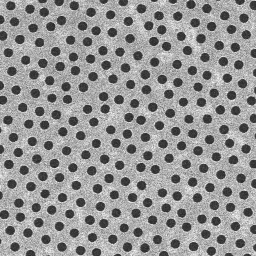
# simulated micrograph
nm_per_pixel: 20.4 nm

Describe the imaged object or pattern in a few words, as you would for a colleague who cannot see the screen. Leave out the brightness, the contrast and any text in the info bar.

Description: a regular array of holes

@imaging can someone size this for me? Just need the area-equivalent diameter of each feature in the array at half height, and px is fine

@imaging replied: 9.37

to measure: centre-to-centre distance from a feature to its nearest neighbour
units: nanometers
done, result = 321